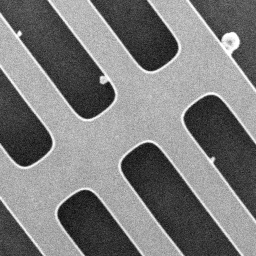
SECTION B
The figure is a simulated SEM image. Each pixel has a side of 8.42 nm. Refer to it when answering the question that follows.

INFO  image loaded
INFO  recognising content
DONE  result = groups of lines, slits or small figures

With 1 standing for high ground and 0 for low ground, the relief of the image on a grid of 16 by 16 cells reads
0001110000110000
0000111000111000
1000011000011100
1100001100011100
1110001111111110
0111000111111111
0011000111110011
0001111111100001
0001111111110000
0001111100111000
1111111100011100
1111111100001100
1111001110001110
0111000111000111
0011000011000011
0011100001100001